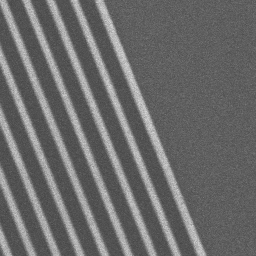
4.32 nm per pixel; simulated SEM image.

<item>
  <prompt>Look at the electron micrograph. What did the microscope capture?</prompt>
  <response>parallel lines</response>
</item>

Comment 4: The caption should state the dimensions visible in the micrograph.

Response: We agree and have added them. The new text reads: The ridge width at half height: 29.6 nanometers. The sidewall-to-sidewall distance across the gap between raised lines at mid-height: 66.7 nm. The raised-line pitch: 96.7 nanometres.